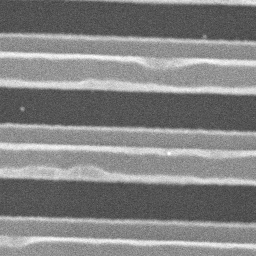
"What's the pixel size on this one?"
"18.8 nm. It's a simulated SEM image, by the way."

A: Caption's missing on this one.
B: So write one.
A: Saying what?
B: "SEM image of lines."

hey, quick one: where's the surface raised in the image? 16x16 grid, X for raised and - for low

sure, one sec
----------------
----------------
XXXXXXXXXX------
XXXXXXXXXXXXXXXX
XXXXXXXXXXXXXXXX
-----XXXXXXXXXXX
----------------
----------------
XXXXXXXXXXXXXXXX
XXXXXXXXXXXXXXXX
XXXXXXXXXXXXXXXX
---------------X
----------------
----------------
XXXXXXXXXXXXXXXX
XXXXXXXXXXXXXXXX